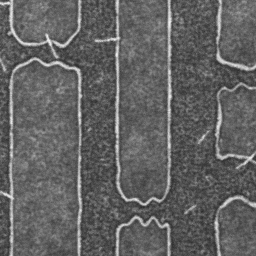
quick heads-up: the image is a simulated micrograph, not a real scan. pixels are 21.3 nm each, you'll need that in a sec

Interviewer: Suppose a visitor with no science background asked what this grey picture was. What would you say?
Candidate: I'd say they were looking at one or a few lines or trenches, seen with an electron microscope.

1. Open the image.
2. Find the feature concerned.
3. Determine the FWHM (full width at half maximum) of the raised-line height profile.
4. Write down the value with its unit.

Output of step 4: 1.04 µm